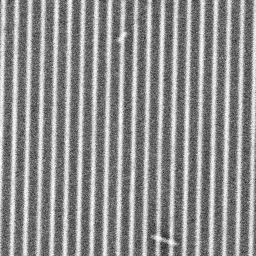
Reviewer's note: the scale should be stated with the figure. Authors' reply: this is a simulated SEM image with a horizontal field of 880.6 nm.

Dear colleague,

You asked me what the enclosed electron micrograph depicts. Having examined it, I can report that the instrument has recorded parallel lines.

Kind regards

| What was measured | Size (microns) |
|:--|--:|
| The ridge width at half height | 0.0086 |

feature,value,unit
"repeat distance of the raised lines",45.7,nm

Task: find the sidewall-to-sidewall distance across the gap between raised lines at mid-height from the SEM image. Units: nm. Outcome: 38.7